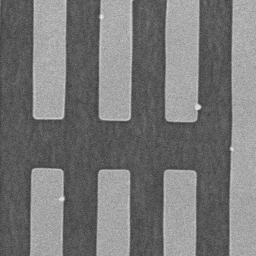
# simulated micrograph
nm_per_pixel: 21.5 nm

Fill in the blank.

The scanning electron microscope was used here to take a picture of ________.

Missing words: groups of lines, slits or small figures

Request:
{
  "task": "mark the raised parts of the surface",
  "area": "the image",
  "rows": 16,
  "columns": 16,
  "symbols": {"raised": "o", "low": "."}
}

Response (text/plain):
..oo..oo..oo...o
..oo..oo..oo...o
..oo..oo..oo...o
..oo..oo..oo...o
..oo..oo..oo...o
..oo..oo..oo...o
..oo..oo..oo...o
...........o...o
...............o
..............oo
..............oo
..oo..oo..oo..oo
..oo..oo..oo..oo
..oo..oo..oo..oo
..oo..oo..oo..oo
..oo..oo..oo..oo